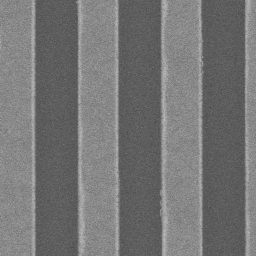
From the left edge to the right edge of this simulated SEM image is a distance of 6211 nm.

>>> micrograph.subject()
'lines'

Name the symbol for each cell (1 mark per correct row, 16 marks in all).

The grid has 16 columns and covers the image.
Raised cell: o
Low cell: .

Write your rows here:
oo...oo...ooo..o
oo...oo...ooo..o
oo...oo...ooo..o
oo...oo...ooo..o
oo...oo...ooo..o
oo...oo...ooo..o
oo...oo...ooo..o
oo...oo...ooo..o
oo...oo...ooo..o
oo...oo...ooo..o
oo...oo...ooo..o
oo...oo...ooo..o
oo...oo...ooo..o
oo...oo...ooo..o
oo...oo...ooo..o
oo...oo...ooo..o